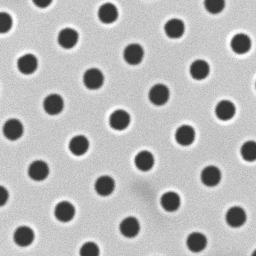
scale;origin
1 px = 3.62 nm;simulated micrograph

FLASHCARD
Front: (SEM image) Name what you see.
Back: a regular array of holes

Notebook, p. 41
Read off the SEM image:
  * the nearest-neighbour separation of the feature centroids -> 47.3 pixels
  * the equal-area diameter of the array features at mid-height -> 0.0754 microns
